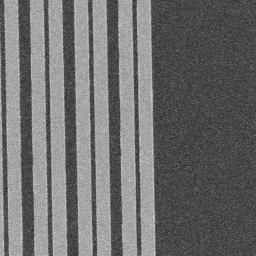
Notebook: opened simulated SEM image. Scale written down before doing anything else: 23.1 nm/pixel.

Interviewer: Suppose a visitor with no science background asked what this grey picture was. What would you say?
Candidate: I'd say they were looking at parallel lines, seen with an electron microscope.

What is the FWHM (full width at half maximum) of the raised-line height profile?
13.2 px